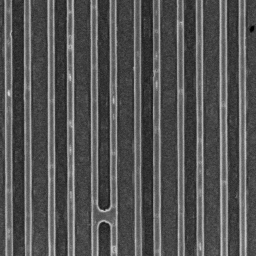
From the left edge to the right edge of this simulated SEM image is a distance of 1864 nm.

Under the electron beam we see parallel lines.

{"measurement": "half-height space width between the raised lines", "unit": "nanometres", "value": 92.8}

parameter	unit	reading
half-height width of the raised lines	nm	49.1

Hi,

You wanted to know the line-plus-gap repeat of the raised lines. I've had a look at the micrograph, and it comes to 155 nm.